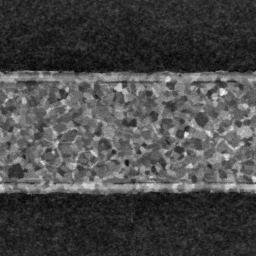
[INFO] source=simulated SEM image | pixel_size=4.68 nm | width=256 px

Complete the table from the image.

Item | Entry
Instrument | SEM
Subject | one or a few lines or trenches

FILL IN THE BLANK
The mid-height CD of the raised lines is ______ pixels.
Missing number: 109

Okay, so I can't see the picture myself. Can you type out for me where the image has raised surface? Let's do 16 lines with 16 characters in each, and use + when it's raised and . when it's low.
................
................
................
................
................
++++++++++++++++
++++++++++++++++
++++++++++++++++
++++++++++++++++
++++++++++++++++
++++++++++++++++
++++++++++++++++
................
................
................
................